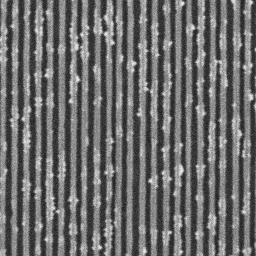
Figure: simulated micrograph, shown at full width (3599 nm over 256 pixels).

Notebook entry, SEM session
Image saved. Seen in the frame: parallel lines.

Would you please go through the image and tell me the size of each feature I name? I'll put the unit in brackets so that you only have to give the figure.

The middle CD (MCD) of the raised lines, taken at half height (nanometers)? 63.3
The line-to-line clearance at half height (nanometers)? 87.9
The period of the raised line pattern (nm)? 163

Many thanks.